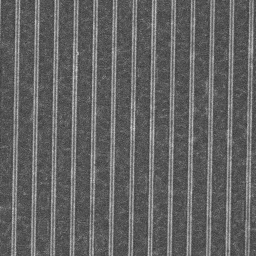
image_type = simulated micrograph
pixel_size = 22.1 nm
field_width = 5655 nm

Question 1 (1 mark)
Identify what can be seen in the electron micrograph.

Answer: parallel lines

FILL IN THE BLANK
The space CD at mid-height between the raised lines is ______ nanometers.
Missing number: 362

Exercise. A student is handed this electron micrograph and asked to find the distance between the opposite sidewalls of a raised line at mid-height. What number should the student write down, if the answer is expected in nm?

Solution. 74.5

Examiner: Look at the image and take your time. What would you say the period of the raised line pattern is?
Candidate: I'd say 430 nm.